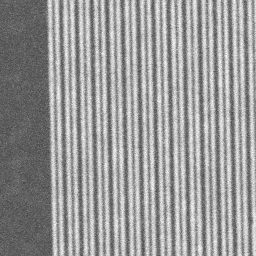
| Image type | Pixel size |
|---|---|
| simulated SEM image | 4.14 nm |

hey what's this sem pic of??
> parallel lines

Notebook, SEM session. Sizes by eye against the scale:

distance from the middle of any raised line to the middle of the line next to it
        31.7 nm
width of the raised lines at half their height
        11.9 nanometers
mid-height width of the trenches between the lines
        19.1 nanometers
